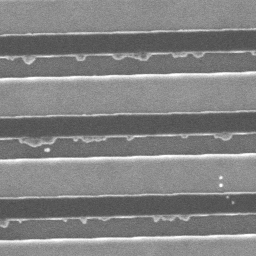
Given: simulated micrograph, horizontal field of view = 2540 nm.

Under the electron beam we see lines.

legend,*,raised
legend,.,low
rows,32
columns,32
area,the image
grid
********************************
********************************
********************************
********************************
********************************
********************************
******************************.*
...*.............*..............
................................
.............*******************
********************************
********************************
********************************
********************************
********************************
********************************
********************************
..*****..****...................
................................
....................************
********************************
********************************
********************************
********************************
********************************
********************************
********************************
***.......*........***..........
................................
...........................*****
********************************
********************************